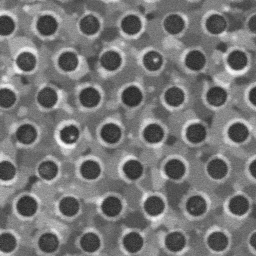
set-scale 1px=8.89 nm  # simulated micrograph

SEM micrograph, a regular array of holes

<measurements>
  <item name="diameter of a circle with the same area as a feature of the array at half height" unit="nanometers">196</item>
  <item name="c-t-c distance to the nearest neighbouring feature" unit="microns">0.369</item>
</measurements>